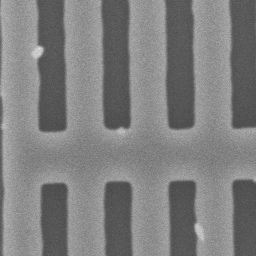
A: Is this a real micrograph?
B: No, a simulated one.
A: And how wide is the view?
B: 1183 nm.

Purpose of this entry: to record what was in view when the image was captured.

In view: groups of lines, slits or small figures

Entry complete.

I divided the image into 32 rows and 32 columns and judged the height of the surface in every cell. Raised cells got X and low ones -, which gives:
XXXXX---XXXXX---XXXXX---XXXXX---
XXXXX---XXXXX---XXXXX---XXXXX---
XXXXX---XXXXX---XXXXX---XXXXX---
XXXXX---XXXXX---XXXXX---XXXXX---
XXXXX---XXXXX---XXXXX---XXXXX---
XXXXX---XXXXX---XXXXX---XXXXX---
XXXXX---XXXXX---XXXXX---XXXXX---
XXXXX---XXXXX---XXXXX---XXXXX---
XXXXX---XXXXX---XXXXX---XXXXX---
XXXXX---XXXXX---XXXXX---XXXXX---
XXXXX---XXXXX---XXXXX---XXXXX---
XXXXX---XXXXX---XXXXX---XXXXX---
XXXXX---XXXXX---XXXXX---XXXXX---
XXXXX---XXXXX---XXXXX---XXXXX---
XXXXX---XXXXX---XXXXX---XXXXX---
XXXXX---XXXXX---XXXXX---XXXXX---
XXXXX--XXXXXXXXXXXXXXXXXXXXXXXXX
XXXXXXXXXXXXXXXXXXXXXXXXXXXXXXXX
XXXXXXXXXXXXXXXXXXXXXXXXXXXXXXXX
XXXXXXXXXXXXXXXXXXXXXXXXXXXXXXXX
XXXXXXXXXXXXXXXXXXXXXXXXXXXXXXXX
XXXXXXXXXXXXXXXXXXXXXXXXXXXXXXXX
-XXXXXXXXXXXXXXXXXXXXX--XXXXXX--
-XXXX---XXXXX---XXXXX----XXXX---
-XXXX---XXXXX----XXXX----XXXX---
-XXXX---XXXXX----XXXX---XXXXX---
-XXXX----XXXX----XXXX---XXXXX---
-XXXX----XXXX----XXXX----XXXX---
-XXXX---XXXXX---XXXXX---XXXXX---
-XXXX---XXXXX----XXXX----XXXX---
-XXXX---XXXXX----XXXX----XXXX---
-XXXX----XXXX----XXXX----XXXX---